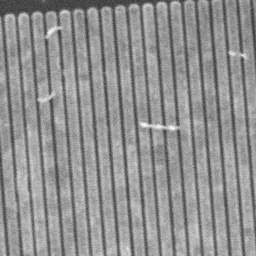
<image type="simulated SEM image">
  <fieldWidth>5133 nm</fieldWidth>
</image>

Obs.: parallel lines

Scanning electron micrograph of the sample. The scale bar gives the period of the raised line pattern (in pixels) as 13.8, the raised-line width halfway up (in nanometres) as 187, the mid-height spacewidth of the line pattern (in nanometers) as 92.4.